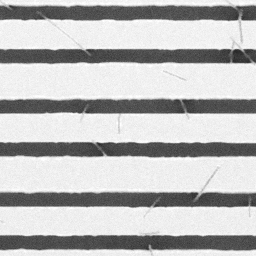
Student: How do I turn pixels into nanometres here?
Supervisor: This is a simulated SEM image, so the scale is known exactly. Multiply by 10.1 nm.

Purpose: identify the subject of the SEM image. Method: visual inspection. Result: lines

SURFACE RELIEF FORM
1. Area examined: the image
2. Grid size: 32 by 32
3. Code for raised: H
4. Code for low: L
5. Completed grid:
HHHHHHHHHHHHHHHHHHHHHHHHHHHHHHHH
LLLLLLLLLLLLLLLLLLLLLLLLLLLLLLLL
LLLLLHHLLLLLLLLLLLLLLLLLLLLLLLLL
HHHHHHHHHHHHHHHHHHHHHHHHHHHHHHHH
HHHHHHHHHHHHHHHHHHHHHHHHHHHHHHHH
HHHHHHHHHHHHHHHHHHHHHHHHHHHHHHHH
LLLLLLLLLLLLLLLLLLLLLLLLLLLLLLLL
LLLLLLLLLLLLLLLLLLLLLLLLLLLLLLLL
HHHHHHHHHHHHHHHHHHHHHHHHHHHHHHHH
HHHHHHHHHHHHHHHHHHHHHHHHHHHHHHHH
HHHHHHHHHHHHHHHHHHHHHHHHHHHHHHHH
HHHHHHHHHHHHHHHHHHHHHHHHHHHHHHHH
LLLLLLLLLLLLLLLLLLLLLLLLLLLLLLLL
LLLLLLLLLLLLLLLLLLLLLLLLLLLLLLLL
HHHHHHHHHHHHHHHHHHHHHHHHHHHHHHHH
HHHHHHHHHHHHHHHHHHHHHHHHHHHHHHHH
HHHHHHHHHHHHHHHHHHHHHHHHHHHHHHHH
HHHHHHHHHHHHHHHHHHHHHHHHHHHHHHHH
LLLLLLLLLLLLLLLLLLLLLLLLLLLLLLLL
LLLLLLLLLLLLLLLLLLLLLLLLLLLLLLLL
HHHHHHHHHHHHHHHHHHHHHHHHHHHHHHHH
HHHHHHHHHHHHHHHHHHHHHHHHHHHHHHHH
HHHHHHHHHHHHHHHHHHHHHHHHHHHHHHHH
HHHHHHHHHHHHHHHHHHHHHHHHHHHHHHHH
LLLLLLLLLLLLLLLLLLLLLLLLLLLLLLLL
LLLLLLLLLLLLLLLLLLLLLLLLLLLLLLLL
HHHHHHHHHHHHHHHHHHHHHHHHHHHHHHHH
HHHHHHHHHHHHHHHHHHHHHHHHHHHHHHHH
HHHHHHHHHHHHHHHHHHHHHHHHHHHHHHHH
LLLLLLLLLLLLLLLLLLLLLLLLLLLLLLLL
LLLLLLLLLLLLLLLLLLLLLLLLLLLLLLLL
HHHHHHHHHHHHHHHHHHHHHHHHHHHHHHHH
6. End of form